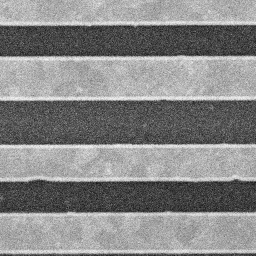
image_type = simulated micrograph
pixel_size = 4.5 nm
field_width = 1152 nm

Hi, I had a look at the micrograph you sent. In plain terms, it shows one or a few lines or trenches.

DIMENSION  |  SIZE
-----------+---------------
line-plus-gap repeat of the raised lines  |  348 nm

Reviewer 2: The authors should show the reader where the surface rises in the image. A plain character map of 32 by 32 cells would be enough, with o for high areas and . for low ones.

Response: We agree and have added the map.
oooooooooooooooooooooooooooooooo
oooooooooooooooooooooooooooooooo
oooooooooooooooooooooooooooooooo
................................
................................
................................
................................
oooooooooooooooooooooooooooooooo
oooooooooooooooooooooooooooooooo
oooooooooooooooooooooooooooooooo
oooooooooooooooooooooooooooooooo
oooooooooooooooooooooooooooooooo
................................
................................
................................
................................
................................
................................
oooooooooooooooooooooooooooooooo
oooooooooooooooooooooooooooooooo
oooooooooooooooooooooooooooooooo
oooooooooooooooooooooooooooooooo
................................
................................
................................
................................
................................
oooooooooooooooooooooooooooooooo
oooooooooooooooooooooooooooooooo
oooooooooooooooooooooooooooooooo
oooooooooooooooooooooooooooooooo
................................